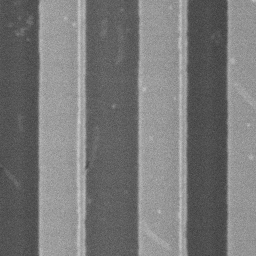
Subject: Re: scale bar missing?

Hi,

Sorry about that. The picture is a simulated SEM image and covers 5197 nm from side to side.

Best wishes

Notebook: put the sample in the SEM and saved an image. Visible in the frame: lines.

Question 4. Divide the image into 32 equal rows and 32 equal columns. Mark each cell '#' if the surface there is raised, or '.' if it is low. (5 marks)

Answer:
.....######.......#####......###
.....######.......#####......###
.....######.......#####......###
.....######.......#####......###
.....######.......#####......###
.....######.......#####......###
.....######.......#####......###
.....######.......#####......###
.....######......######......###
.....#####.......######......###
.....#####.......######......###
.....######.......#####......###
.....######.......#####......###
.....######.......#####......###
.....######.......#####......###
.....######.......#####......###
.....######.......#####......###
.....######.......#####......###
.....######.......#####......###
.....######.......#####......###
.....######.......#####......###
.....######.......#####......###
.....######.......#####......###
.....######.......#####......###
.....######.......#####......###
.....######......######......###
.....######......######......###
.....#####........#####......###
.....######.......#####......###
.....######......######......###
.....######.......#####......###
.....######......######......###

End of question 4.